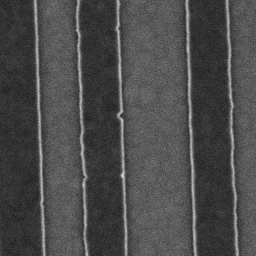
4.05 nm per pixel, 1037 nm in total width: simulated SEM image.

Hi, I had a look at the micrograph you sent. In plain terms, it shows one or a few lines or trenches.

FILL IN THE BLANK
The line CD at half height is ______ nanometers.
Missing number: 170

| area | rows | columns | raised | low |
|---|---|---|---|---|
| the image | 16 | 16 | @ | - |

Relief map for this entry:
@@---@@-----@@--
@@---@@-----@@--
@@---@@-----@@--
@@---@@-----@@--
@@---@@@----@@--
@@---@@@----@@--
@@---@@@----@@@-
@@---@@@----@@--
@@@--@@@----@@@-
@@@--@@@----@@@-
@@@--@@@----@@@-
@@@--@@@----@@@-
@@@--@@@----@@@-
@@@--@@@----@@@-
@@@--@@@----@@@-
@@@--@@@----@@@-